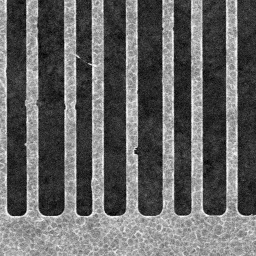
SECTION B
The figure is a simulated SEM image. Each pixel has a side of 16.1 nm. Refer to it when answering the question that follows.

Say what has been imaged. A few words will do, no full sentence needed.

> parallel lines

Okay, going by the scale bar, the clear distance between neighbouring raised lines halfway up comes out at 0.371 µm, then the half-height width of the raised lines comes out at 180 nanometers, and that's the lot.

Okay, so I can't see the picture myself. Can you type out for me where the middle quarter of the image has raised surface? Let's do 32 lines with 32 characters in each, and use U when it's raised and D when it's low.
UUUDDDDUUUDDDDDDUUDDDDDDDUUDDDDD
UUUDDDDUUUDDDDDDUUDDDDDDDUUDDDDD
UUUDDDDUUUDDDDDDUUDDDDDDDUUDDDDD
UUUDDDDUUUDDDDDDUUDDDDDDDUUDDDDD
UUUDDDDUUUDDDDDDUUDDDDDDDUUDDDDD
UUUDDDDUUUDDDDDDUUDDDDDDDUUDDDDD
UUUDDDDUUUDDDDDDUUDDDDDDDUUDDDDD
UUUDDDDUUUDDDDDDUUDDDDDDDUUDDDDD
UUUDDDDUUUDDDDDDUUDDDDDDDUUDDDDD
UUUDDDDUUUDDDDDDUUDDDDDDDUUDDDDD
UUUDDDDUUUDDDDDDUUDDDDDDDUUDDDDD
UUUDDDDUUUDDDDDDUUDDDDDDDUUDDDDD
UUUDDDDUUUDDDDDDUUDDDDDDDUUDDDDD
UUUDDDDUUUDDDDDDUUDDDDDDDUUDDDDD
UUUDDDDUUUDDDDDDUUDDDDDDDUUDDDDD
UUUDDDDUUUDDDDDDUUDDDDDDDUUDDDDD
UUUDDDDUUUDDDDDDUUDDDDDDDUUDDDDD
UUUDDDDUUUDDDDDDUUDDDDDDDUUDDDDD
UUUDDDDUUUDDDDDDUUDDDDDDDUUDDDDD
UUUDDDDUUUDDDDDDUUDDDDDDDDUDDDDD
UUUDDDDUUUDDDDDDUUDDDDDDDUUDDDDD
UUUDDDDUUUDDDDDDUUDDDDDDDUUDDDDD
UUUDDDDUUUDDDDDDUUDDDDDDDUUDDDDD
UUUDDDDUUUDDDDDDUUDDDDDDDUUDDDDD
UUUDDDDUUUDDDDDDUUDDDDDDDUUDDDDD
UUUDDDDUUUDDDDDDUUDDDDDDDUUDDDDD
UUUDDDDUUUDDDDDDUUDDDDDDDUUDDDDD
UUUDDDDUUUDDDDDDUUDDDDDDDUUDDDDD
UUUDDDDUUUDDDDDDUUDDDDDDDUUDDDDD
UUUDDDDUUUDDDDDDUUDDDDDDDUUDDDDD
UUUDDDDUUUDDDDDDUUDDDDDDDUUDDDDD
UUUDDDDUUUDDDDDDUUDDDDDDDUUDDDDD